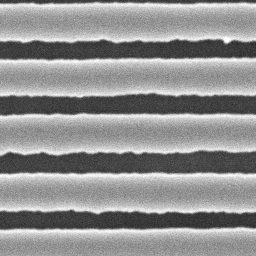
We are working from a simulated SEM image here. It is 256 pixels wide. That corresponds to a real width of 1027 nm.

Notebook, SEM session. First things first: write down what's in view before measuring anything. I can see lines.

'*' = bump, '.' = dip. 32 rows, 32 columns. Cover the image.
..***.*.**************..********
********************************
********************************
********************************
********************************
................................
................................
******.*************************
********************************
********************************
********************************
********************************
................................
................................
********************************
********************************
********************************
********************************
********************************
................................
................................
................................
********************************
********************************
********************************
********************************
............*.....***..*....**..
................................
.............................**.
********************************
********************************
********************************